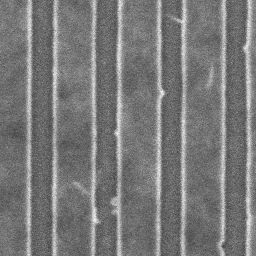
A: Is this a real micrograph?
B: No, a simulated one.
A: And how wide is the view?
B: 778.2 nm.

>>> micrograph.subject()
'one or a few lines or trenches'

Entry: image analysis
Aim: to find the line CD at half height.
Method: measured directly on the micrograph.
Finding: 124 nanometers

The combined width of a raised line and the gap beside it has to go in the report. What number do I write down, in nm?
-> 196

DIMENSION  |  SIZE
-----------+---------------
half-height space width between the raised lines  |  72.2 nanometers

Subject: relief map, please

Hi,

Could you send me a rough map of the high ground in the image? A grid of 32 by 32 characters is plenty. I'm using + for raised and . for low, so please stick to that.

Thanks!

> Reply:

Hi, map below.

++++...+++++...+++++...+++++...+
++++...+++++...+++++...+++++...+
++++...+++++...+++++...+++++...+
++++...+++++...+++++...+++++...+
++++...+++++...+++++...+++++...+
++++...+++++...+++++...+++++...+
++++...+++++...+++++...+++++...+
++++...+++++...+++++...+++++...+
++++...+++++...+++++...+++++...+
++++...+++++...+++++...+++++...+
++++...+++++...+++++...+++++...+
++++...+++++...+++++...+++++...+
++++...+++++...+++++...+++++...+
++++...+++++...+++++...+++++...+
++++...+++++...+++++...+++++...+
++++...+++++...+++++...+++++...+
++++...+++++...+++++...+++++...+
++++...+++++...+++++...+++++...+
++++...+++++...+++++...+++++...+
++++...+++++...+++++...+++++...+
++++...+++++...+++++...+++++...+
++++...+++++...+++++...+++++...+
++++...+++++...+++++...+++++...+
++++...+++++...+++++...+++++...+
++++...+++++...+++++...+++++...+
++++...+++++...+++++...+++++...+
++++...+++++...+++++...+++++...+
++++...+++++...+++++...+++++...+
++++...+++++...+++++...+++++...+
++++...+++++...+++++...+++++...+
++++...+++++...+++++...+++++...+
++++...+++++...+++++...+++++...+